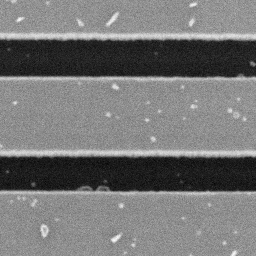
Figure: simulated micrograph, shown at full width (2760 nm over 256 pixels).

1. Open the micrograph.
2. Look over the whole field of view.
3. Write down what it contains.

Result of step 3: lines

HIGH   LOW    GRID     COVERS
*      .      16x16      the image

****************
****************
................
................
................
****************
****************
****************
****************
****************
................
................
****************
****************
****************
****************